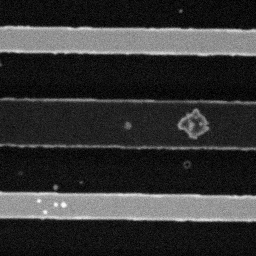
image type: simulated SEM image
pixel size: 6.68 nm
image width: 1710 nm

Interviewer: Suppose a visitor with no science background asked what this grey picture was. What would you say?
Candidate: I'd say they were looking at lines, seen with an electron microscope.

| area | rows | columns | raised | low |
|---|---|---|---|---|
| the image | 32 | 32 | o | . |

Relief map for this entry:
................................
................................
................................
oooooooooooo....................
oooooooooooooooooooooooooooooooo
oooooooooooooooooooooooooooooooo
.ooooooooooooooooooooooooooooooo
................................
................................
................................
................................
................................
oooooooooooo....................
oooooooooooooooooooooooooooooooo
oooooooooooooooooooooooooooooooo
oooooooooooooooooooooooooooooooo
oooooooooooooooooooooooooooooooo
oooooooooooooooooooooooooooooooo
.................o...ooooooooooo
................................
................................
................................
................................
................................
ooooooooooooooooooooooooo.......
oooooooooooooooooooooooooooooooo
oooooooooooooooooooooooooooooooo
......................oooooooooo
................................
................................
................................
................................